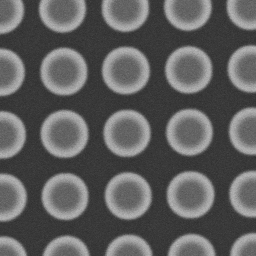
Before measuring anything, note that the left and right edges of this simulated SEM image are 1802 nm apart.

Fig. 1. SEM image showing an array of small figures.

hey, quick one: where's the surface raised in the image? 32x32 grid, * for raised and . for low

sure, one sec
***..******..*****...*****..****
***..******..******..*****..****
***..*****...*****...*****...***
**....***.....***.....***.....**
................................
................................
**....****....****....***....***
***..*****...*****...*****...***
***..******..******..*****...***
***..******..******..*****...***
***...****...*****...*****...***
**.....**......**......*........
................................
...............................*
**....****....****....****...***
***..******..******..*****...***
***..******..******..******..***
***..******..******..*****...***
***...****....****....****....**
*......**......**...............
................................
...............................*
**....****....****....****...***
***..******..******..******..***
***..******..******..******..***
***..******..******..******..***
***...****....****....****....**
*...............................
................................
...............**......**.....**
***...*****...****....****...***
***..******..******..******..***